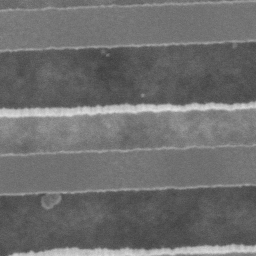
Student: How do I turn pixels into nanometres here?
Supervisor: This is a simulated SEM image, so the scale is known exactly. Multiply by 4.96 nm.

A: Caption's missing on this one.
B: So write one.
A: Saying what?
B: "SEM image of lines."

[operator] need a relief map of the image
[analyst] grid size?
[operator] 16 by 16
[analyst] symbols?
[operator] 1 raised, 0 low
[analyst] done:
1111111111111111
1111111111111111
1111111111111111
0000000000000000
0000000000000000
0000000000000000
0000000000000000
1111111111111111
1111111111111111
1111111111111111
1111111111111111
1111111111111111
0000000000000000
0000000000000000
0000000000000000
0000000000000000